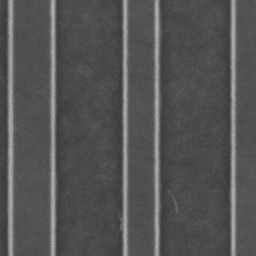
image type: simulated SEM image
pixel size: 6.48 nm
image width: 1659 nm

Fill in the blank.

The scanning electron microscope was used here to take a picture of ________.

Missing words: one or a few lines or trenches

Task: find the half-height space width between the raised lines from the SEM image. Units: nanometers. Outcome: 482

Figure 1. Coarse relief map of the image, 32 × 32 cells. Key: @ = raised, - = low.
-@@@@@@---------@@@@---------@@@
-@@@@@@---------@@@@---------@@@
-@@@@@@---------@@@@---------@@@
-@@@@@@---------@@@@---------@@@
-@@@@@@---------@@@@---------@@@
-@@@@@@---------@@@@---------@@@
-@@@@@@---------@@@@---------@@@
-@@@@@@---------@@@@---------@@@
-@@@@@@---------@@@@---------@@@
-@@@@@@---------@@@@---------@@@
-@@@@@@---------@@@@---------@@@
-@@@@@@---------@@@@---------@@@
-@@@@@@---------@@@@---------@@@
-@@@@@@---------@@@@---------@@@
-@@@@@@---------@@@@---------@@@
-@@@@@@---------@@@@---------@@@
-@@@@@@---------@@@@---------@@@
-@@@@@@---------@@@@---------@@@
-@@@@@@---------@@@@---------@@@
-@@@@@@---------@@@@---------@@@
-@@@@@@---------@@@@---------@@@
-@@@@@@---------@@@@---------@@@
-@@@@@@---------@@@@---------@@@
-@@@@@@---------@@@@---------@@@
-@@@@@@---------@@@@---------@@@
-@@@@@@---------@@@@---------@@@
-@@@@@@---------@@@@---------@@@
-@@@@@@---------@@@@---------@@@
-@@@@@@---------@@@@---------@@@
-@@@@@@---------@@@@---------@@@
-@@@@@@---------@@@@---------@@@
-@@@@@@---------@@@@---------@@@